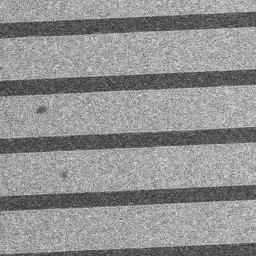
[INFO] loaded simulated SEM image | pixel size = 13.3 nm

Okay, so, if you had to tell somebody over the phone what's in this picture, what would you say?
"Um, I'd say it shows parallel lines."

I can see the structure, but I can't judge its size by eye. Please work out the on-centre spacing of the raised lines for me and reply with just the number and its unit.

0.769 microns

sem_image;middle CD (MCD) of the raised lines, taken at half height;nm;556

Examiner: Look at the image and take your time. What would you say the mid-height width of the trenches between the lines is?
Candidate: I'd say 0.21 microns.